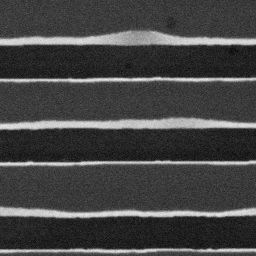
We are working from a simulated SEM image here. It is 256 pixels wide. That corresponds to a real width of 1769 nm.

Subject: lines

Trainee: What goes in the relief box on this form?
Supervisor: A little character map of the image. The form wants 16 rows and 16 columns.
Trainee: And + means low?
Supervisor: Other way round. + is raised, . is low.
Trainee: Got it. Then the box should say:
++++++++++++++++
++++++++++++++++
+++++++...++++++
................
................
++++++++++++++++
++++++++++++++++
++++++++++++++++
................
................
++++++++++++++++
++++++++++++++++
++++++++++++++++
................
................
................